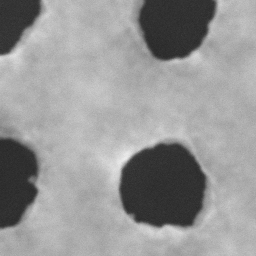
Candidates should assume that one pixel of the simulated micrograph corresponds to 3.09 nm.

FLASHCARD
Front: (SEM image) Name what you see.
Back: holes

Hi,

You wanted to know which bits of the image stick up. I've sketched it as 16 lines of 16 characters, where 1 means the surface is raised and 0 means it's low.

0001111100000011
0011111100000111
0111111110000111
1111111111001111
1111111111111111
1111111111111111
1111111111111111
1111111111111111
1111111111111111
0011111110001111
0001111100000111
0011111000000111
0011111100000111
0011111100000111
1111111111111111
1111111111111111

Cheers